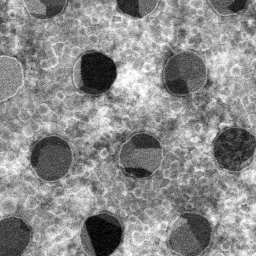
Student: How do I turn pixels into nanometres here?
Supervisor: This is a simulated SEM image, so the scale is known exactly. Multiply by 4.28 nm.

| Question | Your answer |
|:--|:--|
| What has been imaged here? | raised bodies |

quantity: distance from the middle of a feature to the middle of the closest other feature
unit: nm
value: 385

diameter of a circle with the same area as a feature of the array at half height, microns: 0.191